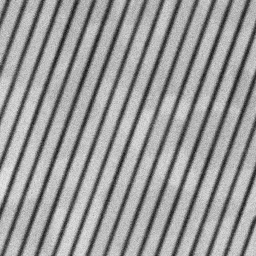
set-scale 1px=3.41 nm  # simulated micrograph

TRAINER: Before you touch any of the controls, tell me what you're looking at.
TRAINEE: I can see parallel lines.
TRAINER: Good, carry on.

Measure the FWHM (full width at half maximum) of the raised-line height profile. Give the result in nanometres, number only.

39.2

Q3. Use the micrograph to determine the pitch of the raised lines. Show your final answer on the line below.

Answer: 16.1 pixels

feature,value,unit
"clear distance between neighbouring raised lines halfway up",4.46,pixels